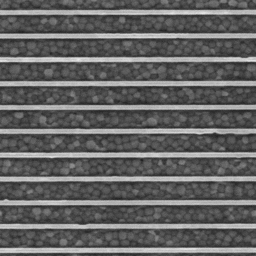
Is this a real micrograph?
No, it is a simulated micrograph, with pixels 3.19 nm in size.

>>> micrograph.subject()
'parallel lines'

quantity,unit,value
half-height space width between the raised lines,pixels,19.7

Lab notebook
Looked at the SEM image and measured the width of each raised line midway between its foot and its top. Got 13.5 nm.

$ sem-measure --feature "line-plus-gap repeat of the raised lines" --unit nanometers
75.8